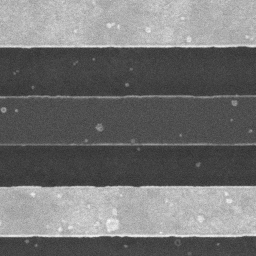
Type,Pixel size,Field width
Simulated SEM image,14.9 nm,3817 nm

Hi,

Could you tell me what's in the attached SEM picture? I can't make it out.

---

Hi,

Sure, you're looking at lines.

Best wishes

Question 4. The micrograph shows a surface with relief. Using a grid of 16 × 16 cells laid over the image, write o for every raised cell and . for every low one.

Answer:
oooooooooooooooo
oooooooooooooooo
oooooooooooooooo
................
................
................
oooooooooooooooo
oooooooooooooooo
oooooooooooooooo
................
................
................
oooooooooooooooo
oooooooooooooooo
oooooooooooooooo
................